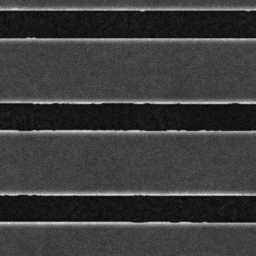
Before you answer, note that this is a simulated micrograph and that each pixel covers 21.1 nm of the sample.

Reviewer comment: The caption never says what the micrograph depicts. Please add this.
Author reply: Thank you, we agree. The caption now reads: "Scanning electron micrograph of lines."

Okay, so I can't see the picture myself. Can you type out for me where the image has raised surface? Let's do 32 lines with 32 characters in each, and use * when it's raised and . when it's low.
********************************
................................
................................
................................
................................
********************************
********************************
********************************
********************************
********************************
********************************
********************************
********************************
................................
................................
................................
********************************
********************************
********************************
********************************
********************************
********************************
********************************
********************************
................................
................................
................................
................................
********************************
********************************
********************************
********************************